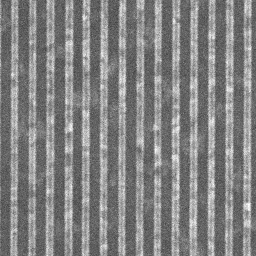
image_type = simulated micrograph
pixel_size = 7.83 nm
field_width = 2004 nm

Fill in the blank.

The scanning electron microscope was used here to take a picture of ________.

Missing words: parallel lines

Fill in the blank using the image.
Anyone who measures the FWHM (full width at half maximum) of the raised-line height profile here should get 0.045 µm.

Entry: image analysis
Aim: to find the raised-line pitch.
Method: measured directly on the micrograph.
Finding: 0.14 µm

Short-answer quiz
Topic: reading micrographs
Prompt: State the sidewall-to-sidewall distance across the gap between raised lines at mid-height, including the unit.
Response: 99.8 nm